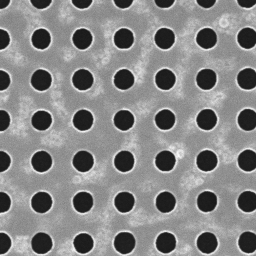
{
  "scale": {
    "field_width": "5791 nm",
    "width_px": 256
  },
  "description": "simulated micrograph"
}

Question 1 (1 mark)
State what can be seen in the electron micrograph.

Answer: a regular array of holes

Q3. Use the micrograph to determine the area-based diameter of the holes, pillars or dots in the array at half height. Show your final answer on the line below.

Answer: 478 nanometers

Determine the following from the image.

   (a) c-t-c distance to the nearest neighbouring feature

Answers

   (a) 918 nm